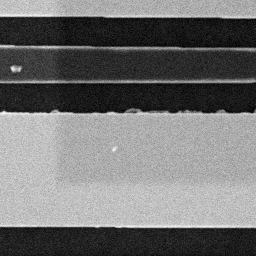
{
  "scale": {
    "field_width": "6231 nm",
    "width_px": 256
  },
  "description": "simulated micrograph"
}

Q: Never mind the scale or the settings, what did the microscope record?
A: lines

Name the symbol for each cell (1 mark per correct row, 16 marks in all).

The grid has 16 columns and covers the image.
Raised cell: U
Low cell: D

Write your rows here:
UUUUUUUUUUUUUUUU
DDDDDDDDDDDDDDDD
DDDDDDDDDDDDDDDD
UUUUUUUUUUUUUUUU
UUUUUUUUUUUUUUUU
DDDDDDDDDDDDDDDD
DDDDDDDDDDDDDDDD
UUUUUUUUUUUUUUUU
UUUUUUUUUUUUUUUU
UUUUUUUUUUUUUUUU
UUUUUUUUUUUUUUUU
UUUUUUUUUUUUUUUU
UUUUUUUUUUUUUUUU
UUUUUUUUUUUUUUUU
DDDDDDDDDDDDDDDD
DDDDDDDDDDDDDDDD